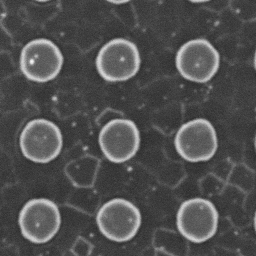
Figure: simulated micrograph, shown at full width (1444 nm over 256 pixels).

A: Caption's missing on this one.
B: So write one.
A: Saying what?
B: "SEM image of a regular array of raised bodies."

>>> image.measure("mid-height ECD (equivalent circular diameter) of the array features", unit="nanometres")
231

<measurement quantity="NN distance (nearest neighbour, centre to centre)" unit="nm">441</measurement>